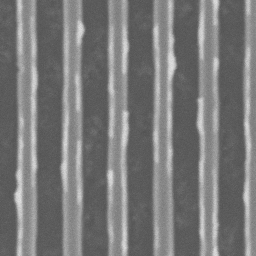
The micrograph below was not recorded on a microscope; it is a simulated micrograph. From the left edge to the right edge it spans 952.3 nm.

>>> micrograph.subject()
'parallel lines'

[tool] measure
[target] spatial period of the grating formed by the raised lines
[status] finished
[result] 169 nanometres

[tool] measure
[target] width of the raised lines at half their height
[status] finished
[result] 66.5 nanometres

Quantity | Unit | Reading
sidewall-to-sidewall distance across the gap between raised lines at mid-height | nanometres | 101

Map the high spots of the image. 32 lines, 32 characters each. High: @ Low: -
--@@----@@----@@---@@@---@@----@
--@@----@@----@@---@@@---@@----@
--@@----@@----@@---@@@---@@----@
--@@----@@@---@@---@@@---@@----@
--@@----@@----@@---@@@---@@----@
--@@@---@@----@@---@@@---@@----@
--@@@---@@----@@---@@@---@@----@
--@@----@@----@@---@@@---@@----@
--@@@---@@----@@---@@@---@@----@
--@@@---@@----@@---@@@---@@----@
--@@@---@@----@@---@@----@@----@
--@@@---@@----@@---@@----@@----@
--@@----@@----@@---@@----@@----@
--@@----@@----@@---@@----@@----@
--@@----@@----@@---@@----@@----@
--@@----@@----@@---@@----@@----@
--@@----@@----@@---@@----@@----@
--@@----@@----@@---@@----@@----@
--@@----@@----@@---@@@---@@----@
--@@@---@@----@@---@@@---@@----@
--@@@---@@----@@---@@----@@----@
--@@@---@@---@@@---@@----@@----@
--@@----@@---@@@---@@----@@----@
--@@----@@----@@---@@----@@----@
--@@----@@----@@---@@----@@---@@
--@@----@@----@@---@@----@@----@
--@@----@@----@@---@@----@@----@
--@@----@@----@@---@@----@@----@
--@@----@@----@@---@@----@@----@
--@@----@@----@@---@@----@@----@
--@@----@@----@@---@@----@@----@
--@@----@@----@@---@@@---@@----@